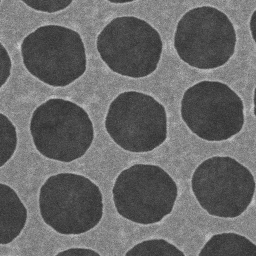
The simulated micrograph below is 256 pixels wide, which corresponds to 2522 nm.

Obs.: a regular array of holes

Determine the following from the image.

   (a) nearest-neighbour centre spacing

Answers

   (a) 725 nm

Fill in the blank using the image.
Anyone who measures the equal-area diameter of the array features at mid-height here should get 617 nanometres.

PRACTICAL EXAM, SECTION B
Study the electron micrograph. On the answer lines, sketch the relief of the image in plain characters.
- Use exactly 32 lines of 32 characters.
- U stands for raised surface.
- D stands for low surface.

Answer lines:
UUUDDDDDDUUUUUUUUUUUUUUUUUUUUUUU
UUUUUUDUUUUUUUUUUUUUUUUDDDDDUUUU
UUUUUUUUUUUUUUDDDDUUUUDDDDDDDUUD
UUUUUDDDUUUUUDDDDDDUUUDDDDDDDUUD
UUUDDDDDDDUUDDDDDDDDUUDDDDDDDUUU
UUUDDDDDDDUUDDDDDDDDUUDDDDDDDUUU
DUUDDDDDDDDUDDDDDDDDUUDDDDDDDUUU
DUUDDDDDDDDUUDDDDDDDUUUDDDDDDUUU
DUUDDDDDDDDUUUDDDDDUUUUUUDDUUUUU
DUUUDDDDDDUUUUUUDDUUUUUUUUUUUUUU
UUUUUUDDDUUUUUUUUUUUUUUUUDDDUUUU
UUUUUUUUUUUUUUUUDUUUUUUDDDDDDUUU
UUUUUUDDUUUUUUDDDDDUUUUDDDDDDDUU
UUUUUDDDDDUUUUDDDDDDDUUDDDDDDDUU
DUUUDDDDDDDUUDDDDDDDDUUDDDDDDDUU
DDUUDDDDDDDDUDDDDDDDDUUDDDDDDDUU
DDUUDDDDDDDDUDDDDDDDDUUUDDDDDDUU
DDUUDDDDDDDDUUDDDDDDDUUUUUDDUUUU
DDUUUDDDDDDUUUUDDDDUUUUUUUUUUUUU
DUUUUUDDDDUUUUUUUUUUUUUUUUUUUUUU
DUUUUUUUUUUUUUUUUUUUUUUUUDDDDDUU
UUUUUUUUUUUUUUUDDDDDDUUUDDDDDDDU
UUUUUUDDDDDUUUDDDDDDDDUUDDDDDDDD
DUUUUDDDDDDDUUDDDDDDDDUUDDDDDDDD
DDUUUDDDDDDDDUDDDDDDDDUUDDDDDDDD
DDDUUDDDDDDDDUDDDDDDDDUUUDDDDDDU
DDDUUDDDDDDDDUUDDDDDDUUUUUDDDDUU
DDDUUDDDDDDDDUUUDDDDUUUUUUUUUUUU
DDDUUUUDDDDDUUUUUUUUUUUUUUUUUUUU
DDUUUUUUUUUUUUUUUUUUUUUUUUUDDDUU
DUUUUUUUUUUUUUUUUDDDDUUUUUDDDDDD
UUUUUUUUDDDDUUUUDDDDDDDUUDDDDDDD